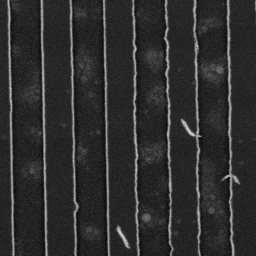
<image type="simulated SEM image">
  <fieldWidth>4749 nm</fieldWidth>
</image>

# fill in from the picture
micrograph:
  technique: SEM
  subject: one or a few lines or trenches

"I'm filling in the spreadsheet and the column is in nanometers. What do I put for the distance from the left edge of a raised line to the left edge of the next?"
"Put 1150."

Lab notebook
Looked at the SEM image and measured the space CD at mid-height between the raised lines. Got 605 nanometers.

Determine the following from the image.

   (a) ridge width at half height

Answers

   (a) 0.543 microns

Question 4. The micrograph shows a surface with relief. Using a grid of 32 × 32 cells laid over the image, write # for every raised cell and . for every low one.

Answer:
#....####....####....###.....###
#....####....####....###.....###
#....####....####....###.....###
#....####....####....###.....###
#....####....####....####....###
#....####....####....####....###
#....####....####....####....###
#....####....####....####....###
#....####....####....###.....###
#....####....####....####....###
#....####....####....####....###
#....####....####....####....###
#....####....####....####....###
#....####....####....####....###
#....####....####....####....###
#....####....####....####....###
#.....###....####....####....###
#.....###....####....####....###
#.....###....####....####....###
#.....###....####....####....###
#.....###....####....####....###
#.....###....####....####....###
#.....###....####....####....###
#.....###....####....####....###
##....###.....###....####....###
##....####....###....####....###
##....###....####....####....###
##....###....####....####....###
##....###.....###....####....###
##....###.....###....####....###
##....###.....###....####....###
##....###.....###....####....###